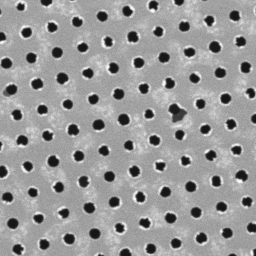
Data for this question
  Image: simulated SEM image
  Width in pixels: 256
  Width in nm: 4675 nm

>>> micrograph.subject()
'a regular array of holes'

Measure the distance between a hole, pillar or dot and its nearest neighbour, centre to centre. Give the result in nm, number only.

471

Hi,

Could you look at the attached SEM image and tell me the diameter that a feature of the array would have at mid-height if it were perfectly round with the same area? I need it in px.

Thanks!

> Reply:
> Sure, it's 10.9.